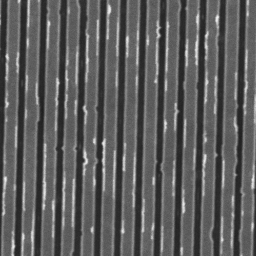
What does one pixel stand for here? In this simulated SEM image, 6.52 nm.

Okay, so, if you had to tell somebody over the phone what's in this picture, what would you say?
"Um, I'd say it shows parallel lines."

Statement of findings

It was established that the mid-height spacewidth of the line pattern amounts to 0.044 µm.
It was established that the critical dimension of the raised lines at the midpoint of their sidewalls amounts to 82.3 nm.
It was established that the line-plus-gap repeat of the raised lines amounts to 130 nm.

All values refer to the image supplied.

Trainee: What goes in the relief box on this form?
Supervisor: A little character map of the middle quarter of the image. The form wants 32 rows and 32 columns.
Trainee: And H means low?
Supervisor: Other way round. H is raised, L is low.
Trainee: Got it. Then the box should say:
LHHLLLHHHLHHHLLHHHHLHHHLLHHHLLHH
LHHLLLHHLLHHHLLHHHLLHHHLLHHHLLHH
LHHLLHHHLLHHHLLHHHLLHHHLLHHHLLHH
HHHLLHHHLLHHHLLHHHLLHHHLLHHHLLHH
HHHLLHHHLLHHHLLHHHLLHHHLLHHHLLHH
HHHLLHHHLLHHHLLHHHLLHHHLLHHHLLHH
HHHLLHHHLLHHHLLHHHLLHHHLLHHHLLHH
HHHLLHHHLLHHHLLHHHLLHHHLLHHHLLHH
HHHLLHHHLLHHHLLHHHLLHHHLLHHHLLHH
HHHLLHHHLLHHHLLHHHLLHHHLLHHHLLHH
HHHLLHHHLLHHHLLHHHLLHHHLLHHHLLHH
HHHLLHHHLLHHHLLHHHLLHHHLLHHHLLHH
HHHLLHHHLLHHHLLHHHLLHHHLLHHHLLHH
HHHLLHHHLLHHHLLHHHLLHHHLLHHHLLHH
HHHLLHHHLLHHHLLHHHLLHHHLLHHHLLHH
HHHLLHHHLLHHHLLHHHLLHHHLLHHHLLHH
HHHLLHHHLLHHHLLHHHLLHHHLLHHHLLHH
HHHLLHHHLLHHHLLHHHLLHHHLLHHHLLHH
HHHLLHHHLLHHHLLHHHLLHHHLLHHHLLHH
HHHLLHHHLLHHHLLHHHLLHHHLLHHHLLHH
HHHLLHHHLLHHHLLHHHLLHHHLLHHHLLHH
HHHLLHHHLLHHHLLHHHLLHHHLLHHHLLHH
HHHLLHHHLLHHHLLHHHLLHHHLLHHHLLHH
HHHLLHHHLLHHHLLHHHLLHHHLLHHHLLHH
HHHLLHHHLLHHHLLHHHLLHHHLLHHHLLHH
HHHLLHHHLLHHHLLHHHLLHHHLHHHHLLHH
HHHLLHHHLLHHHLLHHHLLHHHLHHHHLLHH
HHHLLHHHLLHHHLLHHHLLHHHLLHHHLLHH
HHHLLHHHLLHHHLLHHHLLHHHLLHHHLLHH
HHHLLHHHLLHHHLLHHHLLHHHLLHHHLLHH
HHHLLHHHLLHHHLLHHHLLHHHLLHHHLLHH
HHHLLHHHLLHHHLLHHHLLHHHLLHHHLLHH